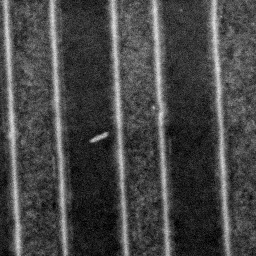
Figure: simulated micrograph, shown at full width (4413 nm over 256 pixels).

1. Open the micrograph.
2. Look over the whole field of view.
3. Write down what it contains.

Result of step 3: one or a few lines or trenches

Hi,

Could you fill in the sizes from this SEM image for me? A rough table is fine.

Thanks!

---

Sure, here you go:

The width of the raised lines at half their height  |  1040 nm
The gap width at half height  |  768 nm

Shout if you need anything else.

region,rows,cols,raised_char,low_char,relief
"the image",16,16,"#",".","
...####...###...
...####...###...
...####...###...
#..####...####..
#..####...####..
#...###...####..
#...###...####..
#...###...####..
#...###...####..
#...####..####..
#...####..####..
#...####..####..
#...####..####..
#...####..####..
#...####..####..
#...####..####..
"